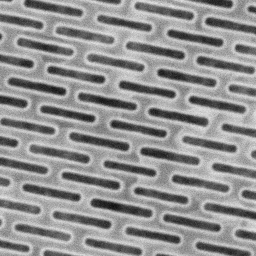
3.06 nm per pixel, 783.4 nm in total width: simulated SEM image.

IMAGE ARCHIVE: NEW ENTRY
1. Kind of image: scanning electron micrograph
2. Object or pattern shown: a regular array of holes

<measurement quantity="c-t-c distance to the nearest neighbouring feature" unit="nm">123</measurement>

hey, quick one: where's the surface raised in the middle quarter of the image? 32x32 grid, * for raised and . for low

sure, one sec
************........************
...*************....***....*****
.........**************.........
*.........**************........
******....****...************...
**************.........*********
.**************............*****
.***...*************........****
***.........**************..***.
*****............**************.
*********.........**************
..*************...***.....******
......***************..........*
........***************.........
*****...****....*************...
..**********........************
**************...........*******
*....***************......******
*.........**************.****...
***.............**************..
*******.........****************
.************...***......*******
.....**************...........**
.......***************..........
***...****....*************.....
**********........**************
************...........*********
....**************.....*********
..........*****************.....
***...........*************.....
********......*****************.
************..***......*********